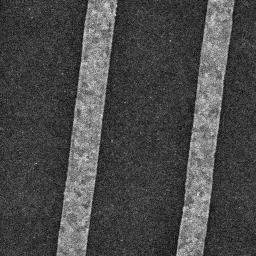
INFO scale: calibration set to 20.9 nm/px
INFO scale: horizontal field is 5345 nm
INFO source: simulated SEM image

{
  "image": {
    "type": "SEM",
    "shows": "one or a few lines or trenches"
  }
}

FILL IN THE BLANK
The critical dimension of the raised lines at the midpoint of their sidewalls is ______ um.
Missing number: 0.536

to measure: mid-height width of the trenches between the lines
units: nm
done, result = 1910